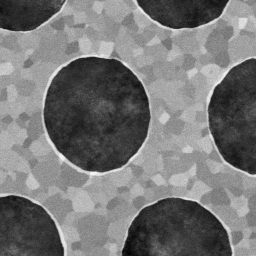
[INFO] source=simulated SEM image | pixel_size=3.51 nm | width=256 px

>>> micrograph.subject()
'holes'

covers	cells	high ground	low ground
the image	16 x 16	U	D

DDDDUUUUUDDDDDUU
DDDUUUUUUUDDDUUU
UUUUUUUUUUUUUUUU
UUUUUUUUUUUUUUUU
UUUUDDDDUUUUUUDD
UUUDDDDDDUUUUDDD
UUUDDDDDDUUUUDDD
UUUDDDDDDUUUUDDD
UUUDDDDDDUUUUDDD
UUUUDDDDDUUUUUDD
UUUUUDDUUUUUUUUD
UUUUUUUUUUUUUUUU
DDUUUUUUUUDDUUUU
DDDUUUUUDDDDDUUU
DDDDUUUUDDDDDDUU
DDDDUUUUDDDDDDUU